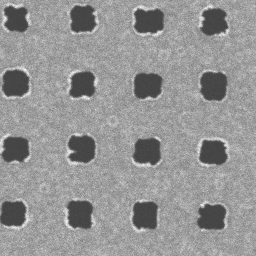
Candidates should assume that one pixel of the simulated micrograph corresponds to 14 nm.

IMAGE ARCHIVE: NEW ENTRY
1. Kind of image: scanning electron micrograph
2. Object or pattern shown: a regular array of holes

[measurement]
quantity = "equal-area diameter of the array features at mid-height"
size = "402 nanometers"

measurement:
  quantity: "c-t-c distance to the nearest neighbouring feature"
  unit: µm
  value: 0.903